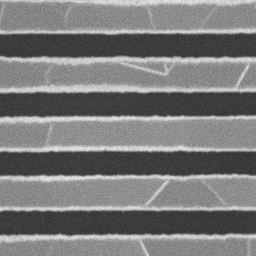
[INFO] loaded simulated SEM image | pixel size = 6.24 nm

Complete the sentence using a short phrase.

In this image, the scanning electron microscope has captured lines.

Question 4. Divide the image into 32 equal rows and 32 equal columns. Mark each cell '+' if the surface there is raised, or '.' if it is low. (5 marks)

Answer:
++++++++++++++++++++++++++++++++
++++++++++++++++++++++++++++++++
++++++++++++++++++++++++++++++++
++++++++++++++++++++++++++++++++
................................
................................
................................
++++++++++++++++++++++++++++++++
++++++++++++++++++++++++++++++++
++++++++++++++++++++++++++++++++
++++++++++++++++++++++++++++++++
................................
................................
................................
................................
++++++++++++++++++++++++++++++++
++++++++++++++++++++++++++++++++
++++++++++++++++++++++++++++++++
++++++++++++++++++++++++++++++++
................................
................................
................................
++++++++++++++++++++++++++++++++
++++++++++++++++++++++++++++++++
++++++++++++++++++++++++++++++++
++++++++++++++++++++++++++++++++
................................
................................
................................
.......+...+.++..+++++++++++++++
++++++++++++++++++++++++++++++++
++++++++++++++++++++++++++++++++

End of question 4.